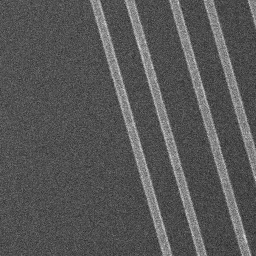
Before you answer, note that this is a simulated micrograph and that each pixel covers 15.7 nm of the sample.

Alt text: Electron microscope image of parallel lines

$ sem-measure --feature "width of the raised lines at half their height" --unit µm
0.125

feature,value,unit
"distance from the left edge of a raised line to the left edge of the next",580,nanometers